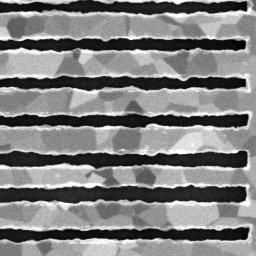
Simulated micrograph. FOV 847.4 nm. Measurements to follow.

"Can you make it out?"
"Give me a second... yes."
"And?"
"parallel lines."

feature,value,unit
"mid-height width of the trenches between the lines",0.0405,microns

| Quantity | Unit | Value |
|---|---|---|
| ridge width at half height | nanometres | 84.8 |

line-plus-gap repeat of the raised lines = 125 nm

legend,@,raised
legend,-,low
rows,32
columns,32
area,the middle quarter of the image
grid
@@@@@@@@@@@@@@@@@@@@@@@@@@@@@@@@
@@@@@@@@@@@@@@@@@@@@@@@@@@@@@@@@
@@@@@@@@@@@@@@@-@@@@@@@@@@@@@@@@
----------------------------@@@-
--------------------------------
--------------------------------
@@@@-----@-@@@@@@@@-----@@--@@@@
@@@@@@@@@@@@@@@@@@@@@@@@@@@@@@@@
@@@@@@@@@@@@@@@@@@@@@@@@@@@@@@@@
@@@@@@@@@@@@@@@@@@@@@@@@@@@@@@@@
@@@@@@@@@@@@@@@@@@@@@@@@@@@@@@@@
@@@@@@@@@@@@@@@@@@@@@@@@@@@@@@@@
@@@@@@@--@@@@@@----@@@@@@@-@@@@@
--------------------------------
--------------------------------
---------------------@@@--------
@@@@@@@@@@@@@@@@@@@@@@@@@@@@@@@@
@@@@@@@@@@@@@@@@@@@@@@@@@@@@@@@@
@@@@@@@@@@@@@@@@@@@@@@@@@@@@@@@@
@@@@@@@@@@@@@@@@@@@@@@@@@@@@@@@@
@@@@@@@@@@@@@@@@@@@@@@@@@@@@@@@@
@@@@@@@@@@@@@@@@@@@@@@@@@@@@@@@@
@@@----------@@----@@@@---------
--------------------------------
--------------------------------
@----@@-------@--@@@@@@@--@-----
@@@@@@@@@@@@@@@@@@@@@@@@@@@@@@@@
@@@@@@@@@@@@@@@@@@@@@@@@@@@@@@@@
@@@@@@@@@@@@@@@@@@@@@@@@@@@@@@@@
@@@@@@@@@@@@@@@@@@@@@@@@@@@@@@@@
---------@@@@@-------@@-@@@@----
--------------------------------